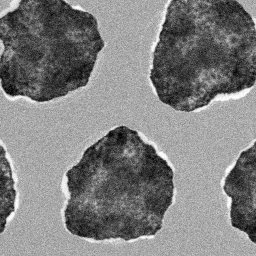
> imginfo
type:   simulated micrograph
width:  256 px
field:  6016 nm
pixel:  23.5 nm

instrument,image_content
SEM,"holes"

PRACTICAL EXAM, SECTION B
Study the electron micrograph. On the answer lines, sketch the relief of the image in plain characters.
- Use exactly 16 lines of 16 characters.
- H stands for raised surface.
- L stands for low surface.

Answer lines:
LLLLLHHHHHLLLLLH
LLLLLLHHHHLLLLLL
LLLLLLHHHHLLLLLL
LLLLLLHHHHLLLLLL
LLLLLLHHHLLLLLLL
LLLLLHHHHHLLLLLL
HHHHHHHHHHLLLHHH
HHHHHHHHHHHHHHHH
HHHHHHHLLHHHHHHH
HHHHHLLLLLHHHHHL
LHHHLLLLLLLHHHHL
LHHHLLLLLLLHHHLL
LHHHLLLLLLLHHHLL
LHHHLLLLLLHHHHLL
HHHHLLLLLLHHHHHL
HHHHHHHHHHHHHHHH